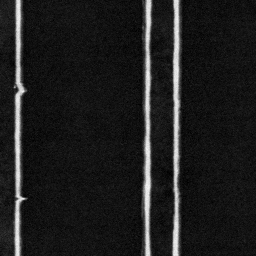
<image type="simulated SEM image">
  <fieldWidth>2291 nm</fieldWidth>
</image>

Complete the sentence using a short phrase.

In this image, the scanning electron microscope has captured one or a few lines or trenches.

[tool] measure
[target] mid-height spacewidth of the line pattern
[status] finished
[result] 1160 nm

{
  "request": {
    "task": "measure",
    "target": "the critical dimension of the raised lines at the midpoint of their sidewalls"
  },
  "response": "256 nm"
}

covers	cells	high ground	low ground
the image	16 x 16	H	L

HLLLLLLLLHHLLLLL
HLLLLLLLLHHLLLLL
HLLLLLLLLHHLLLLL
HLLLLLLLLHHLLLLL
HLLLLLLLLHHLLLLL
HLLLLLLLLHHLLLLL
HLLLLLLLLHHLLLLL
HLLLLLLLLHHLLLLL
HLLLLLLLLHHLLLLL
HLLLLLLLLHHLLLLL
HLLLLLLLLHHLLLLL
HLLLLLLLLHHLLLLL
HLLLLLLLLHHLLLLL
HLLLLLLLLHHLLLLL
HLLLLLLLLHHLLLLL
HLLLLLLLLHHLLLLL